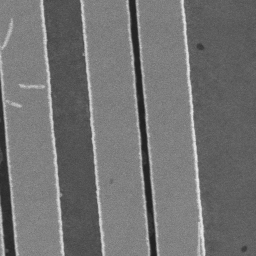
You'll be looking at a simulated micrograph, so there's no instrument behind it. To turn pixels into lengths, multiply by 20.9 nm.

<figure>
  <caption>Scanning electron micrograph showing lines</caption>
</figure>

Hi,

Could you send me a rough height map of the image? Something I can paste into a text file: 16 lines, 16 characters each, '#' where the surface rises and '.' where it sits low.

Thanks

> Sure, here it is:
###..######.....
###..#######....
###..#######....
###..#######....
###..#######....
###...######....
###...######....
###...######....
###...######....
###...######....
.###..######....
.###..######....
.###..#######...
.###..#######...
.###..#######...
.###..#######...